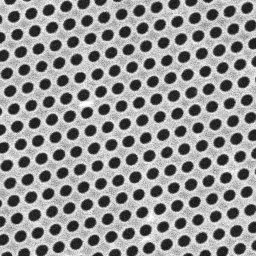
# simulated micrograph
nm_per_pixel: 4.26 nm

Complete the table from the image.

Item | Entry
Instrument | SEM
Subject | a regular array of holes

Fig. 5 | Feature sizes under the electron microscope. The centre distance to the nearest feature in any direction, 75.3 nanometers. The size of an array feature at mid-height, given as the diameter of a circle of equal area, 0.0512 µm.